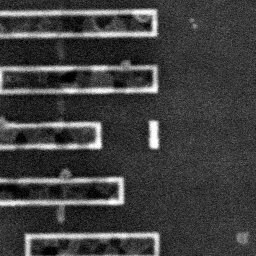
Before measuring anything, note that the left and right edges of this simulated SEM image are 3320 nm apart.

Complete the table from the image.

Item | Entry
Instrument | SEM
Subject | wiring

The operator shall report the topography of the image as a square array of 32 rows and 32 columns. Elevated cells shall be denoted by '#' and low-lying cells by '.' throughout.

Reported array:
................................
................................
###################.............
###################.............
................................
................................
................................
................................
...............##...............
###################.............
###################.............
................................
................................
................................
................................
#...............................
############....................
############....................
................................
................................
................................
........#.......................
.......##.......................
###############.................
###############.................
................................
................................
................................
................................
...............####.............
....################............
....################............